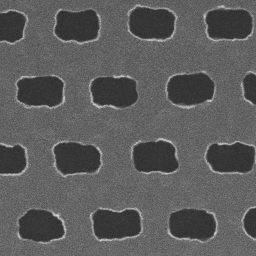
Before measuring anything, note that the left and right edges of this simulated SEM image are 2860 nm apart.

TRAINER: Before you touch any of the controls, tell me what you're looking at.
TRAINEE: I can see a regular array of holes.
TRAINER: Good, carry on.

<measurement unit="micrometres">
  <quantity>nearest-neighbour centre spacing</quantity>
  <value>0.846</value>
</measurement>